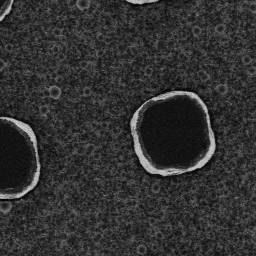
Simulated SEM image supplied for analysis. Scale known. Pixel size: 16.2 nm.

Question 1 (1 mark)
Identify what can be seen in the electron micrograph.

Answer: raised bodies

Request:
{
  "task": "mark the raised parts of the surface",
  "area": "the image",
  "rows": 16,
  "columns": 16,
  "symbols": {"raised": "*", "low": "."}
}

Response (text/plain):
*...............
................
................
................
................
................
.........****...
*.......*****...
**......*****...
**.......****...
**........**....
**..............
................
................
................
................